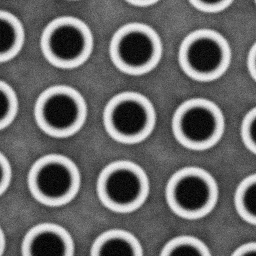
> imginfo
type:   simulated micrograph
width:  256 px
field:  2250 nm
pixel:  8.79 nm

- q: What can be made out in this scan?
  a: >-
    an array of small figures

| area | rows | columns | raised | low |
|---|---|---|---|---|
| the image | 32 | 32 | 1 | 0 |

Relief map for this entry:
00000000000000000110000011111000
10000000000000000000000000000000
11000001110000000000000000000000
11100011111000011110000000000000
11100111111000111111000111110000
11100111111100111111000111110000
11000111111000111111001111111001
10000011111000111111001111111001
00000000000000011110000111110001
00000000000000000000000011100000
10000000000000000000000000000000
11000011110000000000000000000000
11000111110000111100000011000000
11001111111001111110001111100000
11001111111001111110001111110001
10000111110001111110001111110011
00000011100000111110001111110011
00000000000000011100001111100011
00000000000000000000000011000001
00000011000000000000000000000000
10001111100000111000000000000000
10001111110001111100001111000000
10001111110011111100011111100001
10001111110011111110011111100011
00001111100011111100011111100111
00000011000001111100011111100111
00000000000000010000001111000011
00000000000000000000000000000001
00001111000000000000000000000000
00011111100001111000000000000000
10011111100011111000011110000001
00011111100111111100111111000111